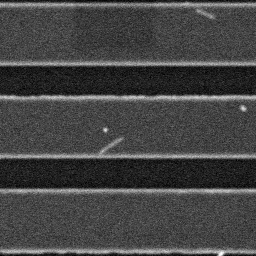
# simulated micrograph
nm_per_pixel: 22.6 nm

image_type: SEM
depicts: lines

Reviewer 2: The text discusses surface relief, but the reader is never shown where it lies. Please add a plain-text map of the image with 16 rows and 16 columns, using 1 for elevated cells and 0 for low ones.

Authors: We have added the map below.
1111111111111111
1111111111111111
1111111111111111
1111111111111111
0000000000000000
0000000000000000
1111111111111111
1111111111111111
1111111111111111
1111111111111111
0000000000000000
0000000000000000
1111111111111111
1111111111111111
1111111111111111
1111111111111111